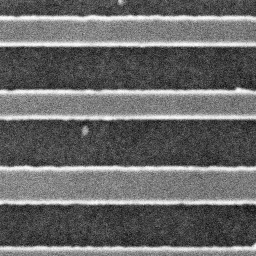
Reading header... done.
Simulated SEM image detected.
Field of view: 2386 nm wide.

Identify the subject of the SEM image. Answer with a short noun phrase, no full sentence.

lines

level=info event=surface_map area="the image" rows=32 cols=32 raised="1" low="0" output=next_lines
00000000000000000000000000000000
00000000000000000000000000000000
11111111111111111111111111111111
11111111111111111111111111111111
11111111111111111111111111111111
11111111111111111111111111111111
00000000000000000000000000000000
00000000000000000000000000000000
00000000000000000000000000000000
00000000000000000000000000000000
00000000000000000000000000000000
11111111111111111111111111111111
11111111111111111111111111111111
11111111111111111111111111111111
11111111111111111111111111111111
00000000000000000000000000000000
00000000000000000000000000000000
00000000000000000000000000000000
00000000000000000000000000000000
00000000000000000000000000000000
00000000000000000000000000000000
11111111111111111111111111111111
11111111111111111111111111111111
11111111111111111111111111111111
11111111111111111111111111111111
00000000000000000000000000000000
00000000000000000000000000000000
00000000000000000000000000000000
00000000000000000000000000000000
00000000000000000000000000000000
00000000000000000000000000000000
11111111111111111111111111111111